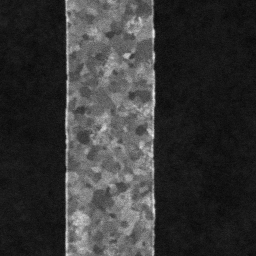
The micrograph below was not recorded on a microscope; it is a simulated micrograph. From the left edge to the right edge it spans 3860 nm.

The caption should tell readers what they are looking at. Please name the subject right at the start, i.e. one or a few lines or trenches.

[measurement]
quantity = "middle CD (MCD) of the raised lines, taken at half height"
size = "1300 nm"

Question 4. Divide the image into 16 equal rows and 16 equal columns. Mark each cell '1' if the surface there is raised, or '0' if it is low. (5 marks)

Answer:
0000111111000000
0000111111000000
0000111111000000
0000111111000000
0000111111000000
0000111111000000
0000111111000000
0000111111000000
0000111111000000
0000111111000000
0000111111000000
0000111111000000
0000111111000000
0000111111000000
0000111111000000
0000111111000000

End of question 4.